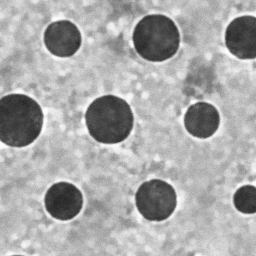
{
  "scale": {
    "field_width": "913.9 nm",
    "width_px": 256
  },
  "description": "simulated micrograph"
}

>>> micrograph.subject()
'holes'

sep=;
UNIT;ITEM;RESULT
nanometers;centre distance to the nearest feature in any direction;331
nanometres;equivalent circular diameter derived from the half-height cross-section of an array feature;149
